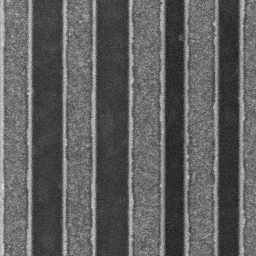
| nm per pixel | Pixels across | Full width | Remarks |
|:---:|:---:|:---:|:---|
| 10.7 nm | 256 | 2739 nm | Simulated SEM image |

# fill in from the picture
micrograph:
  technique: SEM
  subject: one or a few lines or trenches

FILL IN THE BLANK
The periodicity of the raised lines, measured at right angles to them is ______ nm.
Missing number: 663